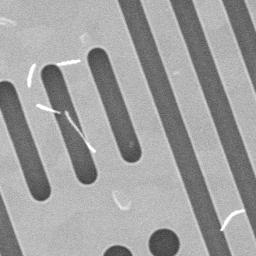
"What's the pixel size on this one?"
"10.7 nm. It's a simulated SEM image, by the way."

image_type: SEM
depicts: groups of lines, slits or small figures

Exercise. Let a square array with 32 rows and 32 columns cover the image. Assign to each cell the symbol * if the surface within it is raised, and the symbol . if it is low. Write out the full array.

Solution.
***************...***...****...*
***************...****...***...*
***************....***...****...
****************...***...****...
****************...****...***...
*****************...***...****..
***********..****...***...****..
***********...***...****...***..
*****..****...****...***...****.
*****...***...****...***...****.
..***...****...***...****...***.
..****...***...****...***...****
..****...****...***...****...***
...***...****...***...****...***
...****...***...****...***...***
*...***...****...***...****...**
*...****...***...****...***...**
*...****...***...****...***...**
**...***...****...***...****...*
**...****...***...****...***...*
**...****...**********...***...*
***...***...**********...****...
***...****..***********...***...
***...*****************...****..
****..*****************...****..
.***********************...***..
.***********************...****.
.***********************...****.
..***********************...***.
..*****************...***...****
..****************.....***...***
...**********...***...****...***